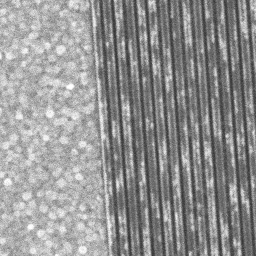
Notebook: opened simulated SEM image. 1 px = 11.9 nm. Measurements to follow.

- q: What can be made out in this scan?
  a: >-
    parallel lines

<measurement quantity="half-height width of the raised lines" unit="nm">81.3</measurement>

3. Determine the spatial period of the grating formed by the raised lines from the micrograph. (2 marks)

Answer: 134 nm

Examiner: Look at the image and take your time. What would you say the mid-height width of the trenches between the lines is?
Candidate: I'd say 57.7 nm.